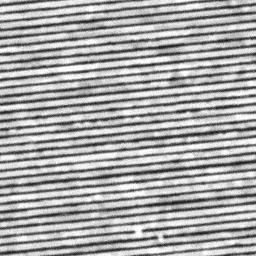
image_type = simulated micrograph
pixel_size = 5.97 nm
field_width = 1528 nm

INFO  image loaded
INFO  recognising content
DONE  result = parallel lines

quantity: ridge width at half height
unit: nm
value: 22.3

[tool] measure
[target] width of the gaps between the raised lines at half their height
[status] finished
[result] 27.5 nanometers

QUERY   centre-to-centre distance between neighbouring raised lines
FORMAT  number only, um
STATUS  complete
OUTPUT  0.0491